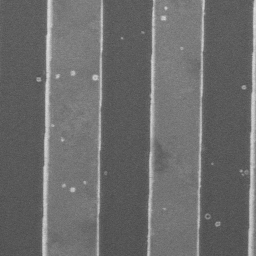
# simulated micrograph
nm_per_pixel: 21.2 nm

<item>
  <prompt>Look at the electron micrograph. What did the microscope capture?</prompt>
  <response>lines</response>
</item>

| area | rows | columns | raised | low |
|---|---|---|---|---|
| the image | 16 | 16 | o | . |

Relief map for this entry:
...ooo....ooo...
...ooo....ooo...
...ooo....ooo...
...ooo....ooo...
...ooo...oooo...
...ooo...oooo...
...ooo...oooo...
...ooo...oooo...
...ooo...oooo...
...ooo...ooo....
...ooo...ooo....
...ooo...ooo....
...ooo...ooo....
...ooo...ooo....
...ooo...ooo....
...ooo...ooo....